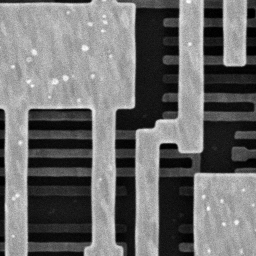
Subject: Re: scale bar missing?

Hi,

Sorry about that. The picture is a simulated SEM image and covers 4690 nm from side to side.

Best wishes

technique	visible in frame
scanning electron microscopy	wiring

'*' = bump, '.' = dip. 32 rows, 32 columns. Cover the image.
*****************.....***...***.
*****************.....***...***.
*****************.....***...***.
*****************.....***...***.
*****************.....***...***.
*****************.....***...***.
*****************.....***...***.
*****************.....***...***.
*****************.....***.......
*****************.....***.......
*****************.....***.......
*****************.....***.......
*****************.....***.......
*********..*****......***.......
.**.........**........***.......
.**.........**.....******.......
.**.........**...********.......
.**.........**...********.......
.**.........**...***..***.......
.**.........**...***............
.**.........**...***............
.**.........**...***............
.**........***...***....********
.**........***...***....********
.**........***...***....********
.**........***...***....********
.**.........**...***....********
.**.........**...***....********
.**.........**...***....********
.**.........**...***....********
.**........****..***....********
.**........****..***....********